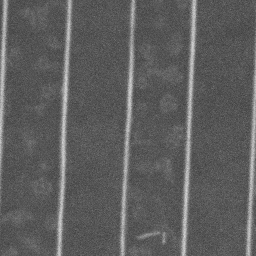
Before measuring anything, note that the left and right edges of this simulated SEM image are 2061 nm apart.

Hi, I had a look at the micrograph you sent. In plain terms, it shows one or a few lines or trenches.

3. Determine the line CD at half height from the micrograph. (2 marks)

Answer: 516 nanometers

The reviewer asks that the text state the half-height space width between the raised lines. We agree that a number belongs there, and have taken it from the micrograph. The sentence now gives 499 nm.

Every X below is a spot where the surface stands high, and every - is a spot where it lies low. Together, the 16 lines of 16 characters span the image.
----XXXX----XXXX
----XXXX----XXXX
----XXXX----XXXX
----XXXX----XXXX
----XXXX----XXXX
----XXXX----XXXX
----XXXX----XXXX
----XXXX----XXXX
----XXXX----XXXX
----XXXX----XXXX
----XXXX----XXXX
----XXXX----XXXX
----XXXX----XXXX
----XXXX----XXXX
----XXXX----XXXX
----XXXX----XXXX